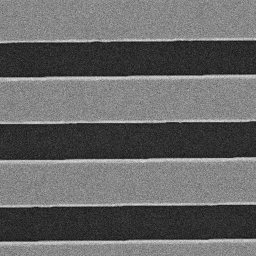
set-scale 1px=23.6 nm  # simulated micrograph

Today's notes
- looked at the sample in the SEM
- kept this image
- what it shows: lines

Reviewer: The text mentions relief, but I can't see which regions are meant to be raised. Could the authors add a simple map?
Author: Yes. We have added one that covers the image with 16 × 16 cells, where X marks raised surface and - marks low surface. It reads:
XXXXXXXXXXXXXXXX
XXXXXXXXXXXXXXXX
XXXXXXXXXXX-----
----------------
----------------
XXXXXXXXXXXXXXXX
XXXXXXXXXXXXXXXX
XXXXXXXXXXXXXXXX
----------------
----------------
XXXXXXXXXXXXXXXX
XXXXXXXXXXXXXXXX
XXXXXXXXXXXXXXXX
----------------
----------------
XXXXXXXXXXXXXXXX